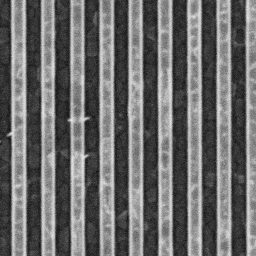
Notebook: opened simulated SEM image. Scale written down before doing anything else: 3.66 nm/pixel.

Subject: parallel lines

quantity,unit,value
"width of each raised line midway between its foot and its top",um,0.042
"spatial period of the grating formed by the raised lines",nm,107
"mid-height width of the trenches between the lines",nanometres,64.4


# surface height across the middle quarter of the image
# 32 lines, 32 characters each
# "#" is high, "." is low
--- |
..###....###.....##.....###....#
..###....###.....##.....###....#
..###....###.....##.....###....#
..###....###.....##.....###....#
..###....###.....##.....###....#
..###....###.....##.....###....#
..###....###.....##.....###....#
..###....###.....##.....###....#
..###....###.....##.....###....#
..###....###....###.....###....#
..###....###....###.....###....#
..###....###....###.....###....#
..###....###....###.....###....#
..###....###....###.....###....#
..###....###.....##.....###....#
..###....###.....##.....###....#
..###....###.....##.....###....#
..###....###.....##.....###....#
..###....###.....##.....###....#
..###....###.....##.....###....#
..###....###.....##.....###....#
..###....###.....##.....###....#
..###....###.....##.....###....#
..###....###.....##.....###....#
..###....###.....##.....###....#
..###....###.....##.....###....#
..###....###.....##.....###....#
..###....###.....##.....###....#
..###....###.....##.....###....#
..###....###.....##.....###....#
..###....###.....##.....###....#
..###....###.....##.....###....#